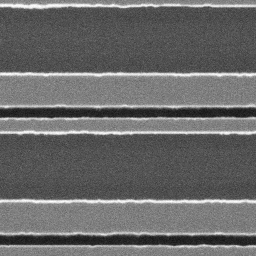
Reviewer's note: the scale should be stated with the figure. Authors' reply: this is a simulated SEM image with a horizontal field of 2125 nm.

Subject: lines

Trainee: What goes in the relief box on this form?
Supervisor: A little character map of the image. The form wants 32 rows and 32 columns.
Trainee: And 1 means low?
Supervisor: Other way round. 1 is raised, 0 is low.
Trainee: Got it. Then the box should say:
11111111111111111111111111111111
00000000000000000000000000000000
00000000000000000000000000000000
00000000000000000000000000000000
00000000000000000000000000000000
00000000000000000000000000000000
00000000000000000000000000000000
00000000000000000000000000000000
00000000000000000000000000000000
11111111111111111111111111111111
11111111111111111111111111111111
11111111111111111111111111111111
11111111111111111111111111111111
11111111111111111111111111111111
11111111111111111111111111111111
11111111111111111111111111111111
11111111111111111111111111111111
00000000000000000000000000000000
00000000000000000000000000000000
00000000000000000000000000000000
00000000000000000000000000000000
00000000000000000000000000000000
00000000000000000000000000000000
00000000000000000000000000000000
00000000000000000000000000000000
11111111111111111111111111111111
11111111111111111111111111111111
11111111111111111111111111111111
11111111111111111111111111111111
11111111111111111111111111111111
11111111111111111111111111111111
11111111111111111111111111111111